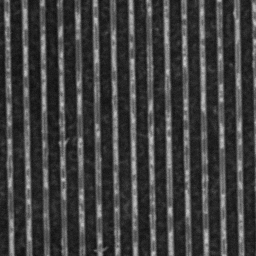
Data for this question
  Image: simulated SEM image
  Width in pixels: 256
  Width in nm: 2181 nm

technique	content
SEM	parallel lines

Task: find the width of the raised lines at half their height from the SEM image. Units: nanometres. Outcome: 39.4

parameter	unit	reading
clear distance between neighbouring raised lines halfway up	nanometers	110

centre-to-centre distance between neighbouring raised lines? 151 nanometers